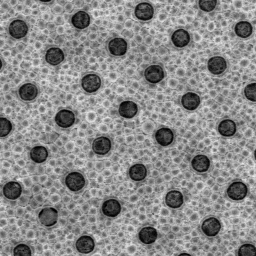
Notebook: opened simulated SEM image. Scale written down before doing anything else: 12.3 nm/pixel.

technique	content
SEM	a regular array of holes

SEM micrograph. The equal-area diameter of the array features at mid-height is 235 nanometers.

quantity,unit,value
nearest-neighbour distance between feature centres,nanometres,546